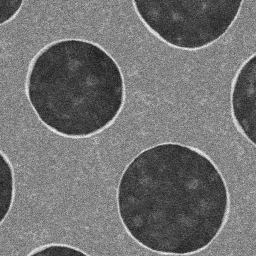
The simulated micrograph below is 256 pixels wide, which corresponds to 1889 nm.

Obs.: holes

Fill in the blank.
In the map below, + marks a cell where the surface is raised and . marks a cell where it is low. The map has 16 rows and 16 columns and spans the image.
.++++++++......+
+++++++++.....++
++++++++++...+++
++.....+++++++++
++.....++++++++.
++......+++++++.
++......+++++++.
+++....++++++++.
+++++++++++++++.
+++++++++...++++
.+++++++.....+++
.++++++.......++
.++++++.......++
++++++++......++
++++++++......++
+++.+++++....+++